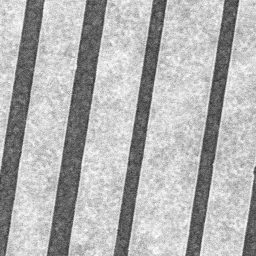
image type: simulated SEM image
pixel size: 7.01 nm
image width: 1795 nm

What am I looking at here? one or a few lines or trenches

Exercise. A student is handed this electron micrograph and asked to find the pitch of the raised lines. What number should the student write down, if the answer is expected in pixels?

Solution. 64.2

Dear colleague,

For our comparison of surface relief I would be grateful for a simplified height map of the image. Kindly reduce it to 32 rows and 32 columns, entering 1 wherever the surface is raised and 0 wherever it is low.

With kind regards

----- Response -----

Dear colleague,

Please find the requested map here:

11100011111001111110011111110011
11100111111001111110011111110011
11100111110001111110011111110011
11100111110001111110111111100111
11100111110001111100111111100111
11000111110001111100111111100111
11000111110011111100111111100111
11000111110011111100111111100111
11001111100011111100111111100111
11001111100011111101111111100111
11001111100011111001111111001111
11001111100011111001111111001111
10001111100011111001111111001111
10001111100111111001111111001111
10011111000111111001111111001111
10011111000111111001111111001111
10011111000111111011111110011111
10011111000111110011111110011111
00011111000111110011111110011111
00011111001111110011111110011111
00111111001111110011111110011111
00111110001111110011111110011111
00111110001111110111111110011111
00111110001111100111111100111110
00111110001111100111111100111110
00111110001111100111111100111110
00111110011111100111111100111110
01111100011111100111111100111110
01111100011111101111111100111110
01111100011111101111111001111110
01111100011111001111111001111100
01111100011111001111111001111100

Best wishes